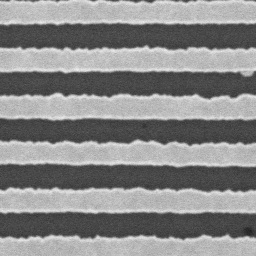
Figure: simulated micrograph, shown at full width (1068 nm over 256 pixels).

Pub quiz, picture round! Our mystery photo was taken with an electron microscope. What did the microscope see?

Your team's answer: lines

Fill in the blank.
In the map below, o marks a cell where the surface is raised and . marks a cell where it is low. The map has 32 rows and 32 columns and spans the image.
oooooooooooooooooooooooooooooooo
oooooooooooooooooooooooooooooooo
oooooooooooooooooooooooooooooooo
................................
................................
................................
oooooooooooooooooooooooooooooooo
oooooooooooooooooooooooooooooooo
oooooooooooooooooooooooooooooooo
................................
................................
................................
oooooooooooooooooooooooooooooooo
oooooooooooooooooooooooooooooooo
oooooooooooooooooooooooooooooooo
................................
................................
................................
oooooooooooooooooooooooooooooooo
oooooooooooooooooooooooooooooooo
..o.....oooooo...ooooooooooooooo
................................
................................
................................
oooooooooooooooooooooooooooooooo
oooooooooooooooooooooooooooooooo
o..........oooo.....ooooo....o.o
................................
................................
......o..................o......
oooooooooooooooooooooooooooooooo
oooooooooooooooooooooooooooooooo